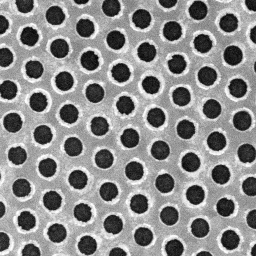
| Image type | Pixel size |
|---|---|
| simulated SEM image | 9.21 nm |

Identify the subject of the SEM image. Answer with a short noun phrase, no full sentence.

a regular array of holes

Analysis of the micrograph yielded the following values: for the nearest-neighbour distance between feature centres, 300 nm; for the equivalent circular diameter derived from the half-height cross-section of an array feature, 185 nanometers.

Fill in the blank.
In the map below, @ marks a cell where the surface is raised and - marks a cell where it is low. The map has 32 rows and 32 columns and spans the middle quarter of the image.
@@@@-----@@@----@@@@@@@@@@-----@
@@@@@@--@@@@----@@@@@@@@@@----@@
--@@@@@@@@@@-----@@@@@@@@@@@-@@@
--@@@@@@@@@@-----@@@---@@@@@@@@@
---@@@@@@@@@@--@@@@-----@@@@@@@@
--@@@@---@@@@@@@@@@-----@@@@@@@@
-@@@@-----@@@@@@@@@@----@@@----@
@@@@@-----@@@@@@@@@@@--@@@@-----
@@@@@@----@@@@---@@@@@@@@@@-----
@@@@@@---@@@@----@@@@@@@@@@-----
---@@@@@@@@@@-----@@@@@@@@@@@--@
----@@@@@@@@@----@@@@----@@@@@@@
----@@@@@@@@@@---@@@@----@@@@@@@
----@@@---@@@@@@@@@@@-----@@@@@@
---@@@@----@@@@@@@@@@----@@@@---
@@@@@@@----@@@@@@@@@@@--@@@@----
@@@@@@@----@@@@---@@@@@@@@@@----
@@@@@@@---@@@@-----@@@@@@@@@----
@---@@@@@@@@@@-----@@@@@@@@@@---
----@@@@@@@@@@-----@@@@--@@@@@@@
-----@@@@@@@@@@---@@@@----@@@@@@
-----@@@@--@@@@@@@@@@@-----@@@@@
@---@@@@----@@@@@@@@@@----@@@@--
@@@@@@@------@@@@@@@@@----@@@---
@@@@@@@@----@@@@---@@@@@@@@@@---
@@@@@@@@----@@@-----@@@@@@@@@---
@@--@@@@@@@@@@@-----@@@@@@@@@@--
@-----@@@@@@@@@-----@@@@@-@@@@@@
@-----@@@@@@@@@@----@@@----@@@@@
@-----@@@@@-@@@@@@@@@@@-----@@@@
@@----@@@----@@@@@@@@@@-----@@@-
@@@@@@@@@-----@@@@@@@@@----@@@@-